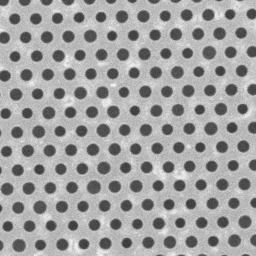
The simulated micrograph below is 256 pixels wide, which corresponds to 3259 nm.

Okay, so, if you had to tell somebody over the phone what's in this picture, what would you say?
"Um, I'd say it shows a regular array of holes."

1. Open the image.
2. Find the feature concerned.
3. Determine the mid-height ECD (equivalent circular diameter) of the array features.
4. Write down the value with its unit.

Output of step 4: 155 nanometres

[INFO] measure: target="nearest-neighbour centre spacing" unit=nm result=270